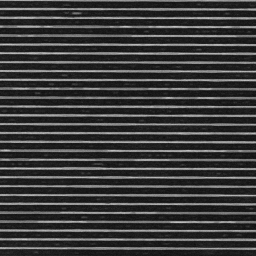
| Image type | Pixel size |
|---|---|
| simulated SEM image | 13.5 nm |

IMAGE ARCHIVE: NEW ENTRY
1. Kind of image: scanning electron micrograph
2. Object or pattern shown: parallel lines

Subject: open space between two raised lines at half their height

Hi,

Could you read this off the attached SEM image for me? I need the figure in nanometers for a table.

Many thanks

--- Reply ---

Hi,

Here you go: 94.5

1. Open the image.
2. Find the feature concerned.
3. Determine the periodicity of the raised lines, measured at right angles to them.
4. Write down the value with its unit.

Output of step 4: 120 nm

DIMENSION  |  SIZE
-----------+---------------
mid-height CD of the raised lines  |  2 px